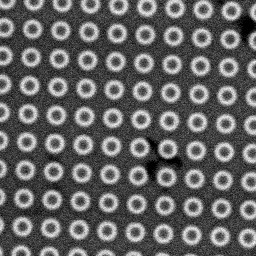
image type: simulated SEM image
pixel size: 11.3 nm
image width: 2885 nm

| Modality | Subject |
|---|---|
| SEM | an array of small figures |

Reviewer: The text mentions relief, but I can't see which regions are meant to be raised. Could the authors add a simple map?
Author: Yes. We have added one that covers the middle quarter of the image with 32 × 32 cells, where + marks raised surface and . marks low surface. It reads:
....++++...++++...++++...++++...
............++....++++...++++...
................................
................................
....+++....+++..................
+..+++++..+++++...+++....+++....
+..+++++..+++++..+++++..+++++...
....++++..+++++..+++++..+++++..+
...........+++....+++....++++...
................................
................................
...++++....++...................
...++++...++++...++++....+++....
...++++...++++...+++++..+++++..+
...++++...++++...+++++..+++++..+
.....+.....+++....+++...++++...+
.........................++.....
................................
...+++.....++...................
...++++...++++...++++...++++....
..+++++...++++...++++...++++...+
...++++...++++...++++...++++...+
....++....+++....++++...++++...+
.........................++.....
................................
...+++....++....................
..+++++..+++++...+++....+++.....
..+++++..+++++..+++++..+++++...+
..++++...+++++..+++++..+++++..++
...++.....+++....+++....++++..++
.........................+.....+
................................